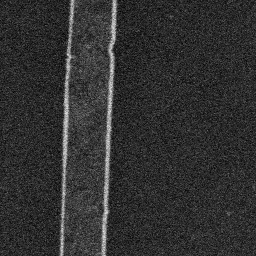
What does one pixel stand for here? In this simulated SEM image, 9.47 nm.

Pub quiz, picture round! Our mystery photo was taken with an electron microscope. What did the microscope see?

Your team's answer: one or a few lines or trenches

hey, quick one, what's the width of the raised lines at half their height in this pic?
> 408 nm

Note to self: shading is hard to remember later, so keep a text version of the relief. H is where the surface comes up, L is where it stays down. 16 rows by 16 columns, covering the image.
LLLLHHHLLLLLLLLL
LLLLHHHLLLLLLLLL
LLLLHHHLLLLLLLLL
LLLLHHHLLLLLLLLL
LLLLHHHLLLLLLLLL
LLLLHHHLLLLLLLLL
LLLLHHHLLLLLLLLL
LLLLHHHLLLLLLLLL
LLLLHHHLLLLLLLLL
LLLLHHHLLLLLLLLL
LLLLHHHLLLLLLLLL
LLLLHHHLLLLLLLLL
LLLLHHHLLLLLLLLL
LLLLHHHLLLLLLLLL
LLLLHHLLLLLLLLLL
LLLLHHLLLLLLLLLL